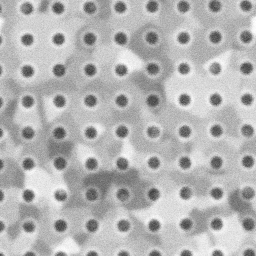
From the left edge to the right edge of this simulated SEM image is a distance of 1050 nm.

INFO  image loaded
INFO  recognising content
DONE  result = a regular array of holes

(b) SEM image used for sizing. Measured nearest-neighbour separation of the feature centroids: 31 pixels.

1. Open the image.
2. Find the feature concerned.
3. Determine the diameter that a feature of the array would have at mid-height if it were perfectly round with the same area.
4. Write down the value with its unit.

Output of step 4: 59.4 nm